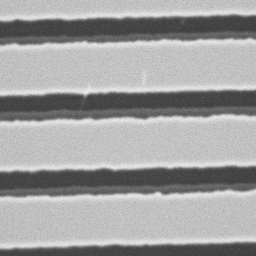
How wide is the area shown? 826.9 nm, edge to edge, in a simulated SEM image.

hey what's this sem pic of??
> lines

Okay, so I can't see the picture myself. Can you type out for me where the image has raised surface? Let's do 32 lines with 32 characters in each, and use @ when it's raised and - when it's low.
@@@@@@@@@@@@@@@@@@@@@@@@@@@@@@@@
@@@@@@@@@@@@@@@@@@@@@@@@@@@@@@@@
@-------------------------------
--------------------------------
--------------------------------
------@-@@@@@@@@@@@@@@@@@@@@@@@@
@@@@@@@@@@@@@@@@@@@@@@@@@@@@@@@@
@@@@@@@@@@@@@@@@@@@@@@@@@@@@@@@@
@@@@@@@@@@@@@@@@@@@@@@@@@@@@@@@@
@@@@@@@@@@@@@@@@@@@@@@@@@@@@@@@@
@@@@@@@@@@@@@@@@@@@@@@@@@@@@@@@@
@@@@@@@@@@@@@@--@---------------
--------------------------------
--------------------------------
--------------------------@@@@@-
@@@@@@@@@@@@@@@@@@@@@@@@@@@@@@@@
@@@@@@@@@@@@@@@@@@@@@@@@@@@@@@@@
@@@@@@@@@@@@@@@@@@@@@@@@@@@@@@@@
@@@@@@@@@@@@@@@@@@@@@@@@@@@@@@@@
@@@@@@@@@@@@@@@@@@@@@@@@@@@@@@@@
@@@@@@@@@@@@@@@@@@@@@@@@@@@@@@@@
--------------------------------
--------------------------------
--------------------------------
---------@@@@@@@@@@@@@@@@@@@@@@@
@@@@@@@@@@@@@@@@@@@@@@@@@@@@@@@@
@@@@@@@@@@@@@@@@@@@@@@@@@@@@@@@@
@@@@@@@@@@@@@@@@@@@@@@@@@@@@@@@@
@@@@@@@@@@@@@@@@@@@@@@@@@@@@@@@@
@@@@@@@@@@@@@@@@@@@@@@@@@@@@@@@@
@@@@@@@@@@@@@@-@@@@-------------
--------------------------------